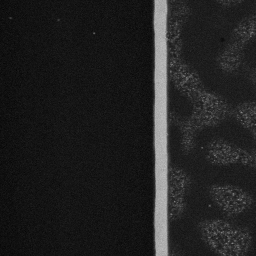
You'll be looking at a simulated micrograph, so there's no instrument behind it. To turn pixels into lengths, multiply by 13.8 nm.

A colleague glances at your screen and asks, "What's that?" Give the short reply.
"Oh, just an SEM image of one or a few lines or trenches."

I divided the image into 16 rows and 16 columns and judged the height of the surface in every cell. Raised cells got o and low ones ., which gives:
..........oooooo
..........oooooo
..........oooooo
..........oooooo
..........oooooo
..........oooooo
..........oooooo
..........oooooo
..........oooooo
..........oooooo
..........oooooo
..........oooooo
..........oooooo
..........oooooo
..........oooooo
..........oooooo